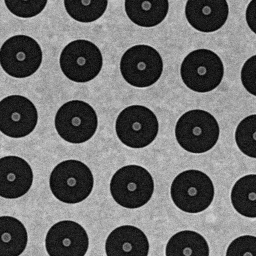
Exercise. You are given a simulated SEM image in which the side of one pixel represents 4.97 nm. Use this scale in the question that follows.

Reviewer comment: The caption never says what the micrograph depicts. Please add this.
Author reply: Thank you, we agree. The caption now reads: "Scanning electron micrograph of an array of small figures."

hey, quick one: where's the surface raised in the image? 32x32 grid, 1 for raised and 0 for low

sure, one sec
10000011000001110010011000001110
10000111000001110000011000000110
11111111100011110000111000001110
11111111111111111111111100001110
11001111111111111111111111111111
00000111000011111111111111111111
00000111000001110000111100011111
00000110000001100000111000001110
00000111000001100100111000001100
10001111000011100000111000001100
11111111111111110001111000011100
11111111111111111111111110111110
00001111101111111111111111111111
00001110000011110011111111111111
00000110000011100001111000011110
00000110010011000000110000011100
00001110000001000000110010011000
11111111000111100001110000011000
11111111111111100011111000011100
10111111111111111111111011111110
00001110000111111111111111111111
00001100000111000001111001111111
00001100000011000001110000111100
00001100000011001001100000011000
00011110000111000001100000011001
11111111111111100011110000111000
11111111111111111111111001111100
00111111011111111111111111111111
00011100001111100111111111111111
10011100000110000011110001111100
00011100100110000001100000111000
00011100000110000001000100110000